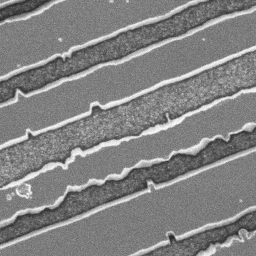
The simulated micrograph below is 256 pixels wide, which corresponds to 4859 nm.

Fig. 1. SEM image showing one or a few lines or trenches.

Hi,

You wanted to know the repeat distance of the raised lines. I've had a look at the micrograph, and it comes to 1.35 um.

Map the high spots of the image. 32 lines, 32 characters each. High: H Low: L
HLLLLLHHHHHHHHHHHHHHHHHHLLLLLLLL
LLLLHHHHHHHHHHHHHHHHHHLLLLLLLLLH
LHHHHHHHHHHHHHHHHHHLLLLLLLLHHHHH
HHHHHHHHHHHHHHHHLLLLLLLLLHHHHHHH
HHHHHHHHHHHHHHLLLLLLLLLHHHHHHHHH
HHHHHHHHHHHLLLLLLLLLHHHHHHHHHHHH
HHHHHHHHHLLLLLLLLLHHHHHHHHHHHHHL
HHHHHHLLLLLLLLLHHHHHHHHHHHHHLLLL
HHHHLLLLLLLLHHHHHHHHHHHHHHLLLLLL
HLLLLLLLLHHHHHHHHHHHHHHLLLLLLLLL
LLLLLLLHHHHHHHHHHHHHLLLLLLLLLLLL
LLLLHHHHHHHHHHHHHHLLLLLLLLLLLLHH
LLHHHHHHHHHHHHHHLLLLLLLLLLLLHHHH
HHHHHHHHHHHLLLLLLLLLLLLLLHHHHHHH
HHHHHHHHHHLLLLLLLLLLLLLHHHHHHHHH
HHHHHHHHLLLLLLLLLLLLLHHHHHHHHHHH
HHHHHLLLLLLLLLLLLLHHHHHHHHHHHHLL
HHLLLLLLLLLLLLLHHHHHHHHHHHHLLLLL
LLLLLLLLLLLLHHHHHHHHHHHHHLLLLLLL
LLLLLLLLLHHHHHHHHHHHHHLLLLLLLHHH
LLLLLLLLHHHHHHHHHHLLLLLLLLLHHHHH
LLLLLHHHHHHHHHHHLLLLLLLLHHHHHHHH
LLLHHHHHHHHHHLLLLLLLLLHHHHHHHHHH
HHHHHHHHHHLLLLLLLLHHHHHHHHHHHHHH
HHHHHHHHLLLLLLLLLHHHHHHHHHHHHHHH
HHHHHHHLLLLLLLHHHHHHHHHHHHHHHHHH
HHHLLLLLLLLHHHHHHHHHHHHHHHHHHHHL
HHLLLLLLLHHHHHHHHHHHHHHHHHHHHLLL
LLLLLLHHHHHHHHHHHHHHHHHHHHLLLLLL
LLLHHHHHHHHHHHHHHHHHHLHLLLLLLLHH
LHHHHHHHHHHHHHHHHHHHLLLLLLLLHHHH
HHHHHHHHHHHHHHHHHHLLLLLLLLHHHHHH